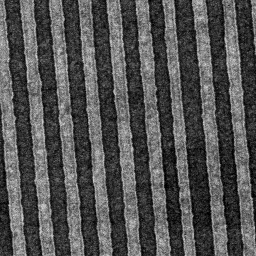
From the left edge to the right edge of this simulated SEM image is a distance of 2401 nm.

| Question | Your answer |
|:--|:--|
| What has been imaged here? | parallel lines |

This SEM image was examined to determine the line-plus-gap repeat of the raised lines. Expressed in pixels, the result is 28.7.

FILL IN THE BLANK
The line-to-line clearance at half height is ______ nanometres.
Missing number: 161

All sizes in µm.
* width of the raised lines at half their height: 0.112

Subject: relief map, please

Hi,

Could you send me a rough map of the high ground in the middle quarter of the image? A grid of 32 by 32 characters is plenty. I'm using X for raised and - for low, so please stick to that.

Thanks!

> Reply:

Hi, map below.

X----XXX----XXX----XXXX---XXX---
X----XXX----XXX----XXX----XXX---
X----XXX----XXX----XXX-----XX---
X----XXX-----XX-----XXX----XX---
X-----XX-----XXX----XXX----XX---
X-----XX-----XXX----XXX----XX---
X-----XX----XXXX----XXX----XX---
X-----XX-----XXX----XXX----XX---
X-----XX-----XXX----XXX----XX---
X-----XXX----XXX----XXX----XX---
XX----XXX----XXX-----XX----XX---
XX----XXX----XXX-----XX----XX---
XX----XXX----XXX-----XX----XXX--
XX----XXX----XXX-----XX-----XX--
XX----XXX----XXX----XXXX----XX--
XX----XXX----XXX-----XXX---XXX--
XX----XXX-----XXX----XXX----XX--
XX----XXX-----XXX----XXX----XX--
XX-----XX-----XXX----XXX----XX--
XX-----XX-----XXX----XXX----XX--
XX-----XXX----XXX----XXX----XX--
XXX----XXX----XXX----XXX----XX--
XXX----XXX----XXX----XXX----XX--
XXX----XXX----XXX-----XX----XXX-
XXX----XXX----XXX----XXX----XXX-
XXX----XXX----XXX----XXX----XXX-
XXX----XXX-----XX-----XXX---XXX-
XXX----XXX----XXX-----XXX----XX-
-XX----XXX-----XXX----XXX----XX-
XXX-----XX-----XXX----XXX----XX-
XXX-----XX-----XXX----XXX----XX-
-XX-----XXX----XXX----XXX----XX-